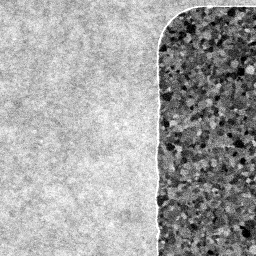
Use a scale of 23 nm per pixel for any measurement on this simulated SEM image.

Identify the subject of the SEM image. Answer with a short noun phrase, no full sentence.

one or a few lines or trenches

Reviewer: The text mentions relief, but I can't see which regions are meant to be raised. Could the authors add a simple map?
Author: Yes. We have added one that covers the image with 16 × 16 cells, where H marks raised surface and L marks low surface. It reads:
LLLLLLLLLLLLHHHH
LLLLLLLLLLLHHHHH
LLLLLLLLLLHHHHHH
LLLLLLLLLLHHHHHH
LLLLLLLLLLHHHHHH
LLLLLLLLLLHHHHHH
LLLLLLLLLLHHHHHH
LLLLLLLLLLHHHHHH
LLLLLLLLLLHHHHHH
LLLLLLLLLLHHHHHH
LLLLLLLLLLHHHHHH
LLLLLLLLLLHHHHHH
LLLLLLLLLLHHHHHH
LLLLLLLLLLHHHHHH
LLLLLLLLLLHHHHHH
LLLLLLLLLLHHHHHH